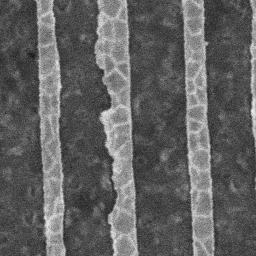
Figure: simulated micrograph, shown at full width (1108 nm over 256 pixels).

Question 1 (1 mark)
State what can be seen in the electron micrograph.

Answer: one or a few lines or trenches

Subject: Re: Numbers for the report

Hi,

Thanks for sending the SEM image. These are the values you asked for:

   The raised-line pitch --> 73.6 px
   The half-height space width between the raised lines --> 49.4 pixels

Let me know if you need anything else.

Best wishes